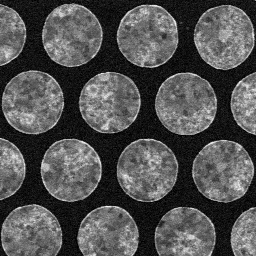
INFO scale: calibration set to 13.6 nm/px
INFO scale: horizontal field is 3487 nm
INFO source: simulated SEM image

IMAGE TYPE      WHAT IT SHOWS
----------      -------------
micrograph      a regular array of raised bodies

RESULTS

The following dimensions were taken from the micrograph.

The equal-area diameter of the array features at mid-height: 838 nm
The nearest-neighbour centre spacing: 1.04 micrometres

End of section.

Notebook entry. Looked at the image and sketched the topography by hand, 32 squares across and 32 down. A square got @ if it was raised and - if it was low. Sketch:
--------------------------------
@@----@@@@@-----@@@@@-----@@@@--
@@@---@@@@@@---@@@@@@@---@@@@@@-
@@@--@@@@@@@@--@@@@@@@--@@@@@@@@
@@@--@@@@@@@@--@@@@@@@--@@@@@@@@
@@@--@@@@@@@@--@@@@@@@--@@@@@@@@
@@@---@@@@@@---@@@@@@@---@@@@@@-
@------@@@@-----@@@@@----@@@@@--
---------------------------@@---
--@@@@------@@@@------@@@------@
-@@@@@@----@@@@@@---@@@@@@----@@
@@@@@@@@--@@@@@@@---@@@@@@@--@@@
@@@@@@@@--@@@@@@@---@@@@@@@--@@@
@@@@@@@@--@@@@@@@--@@@@@@@@--@@@
-@@@@@@---@@@@@@@---@@@@@@@--@@@
-@@@@@@----@@@@@----@@@@@@----@@
---@@--------@@-------@@@------@
@-------@@-------@@-------------
@@----@@@@@-----@@@@@-----@@@@--
@@@---@@@@@@---@@@@@@@---@@@@@@-
@@@--@@@@@@@@--@@@@@@@--@@@@@@@@
@@@--@@@@@@@@--@@@@@@@--@@@@@@@@
@@@--@@@@@@@---@@@@@@@--@@@@@@@-
@@----@@@@@@---@@@@@@----@@@@@@-
@------@@@@-----@@@@@-----@@@@--
--------------------------------
--@@@@-----@@@@@-----@@@@------@
-@@@@@@---@@@@@@@---@@@@@@----@@
@@@@@@@@--@@@@@@@---@@@@@@@--@@@
@@@@@@@@--@@@@@@@--@@@@@@@@--@@@
@@@@@@@@--@@@@@@@--@@@@@@@@--@@@
-@@@@@@---@@@@@@@---@@@@@@---@@@